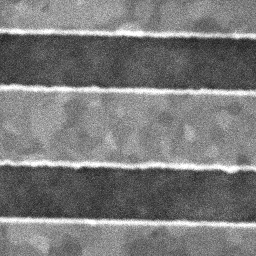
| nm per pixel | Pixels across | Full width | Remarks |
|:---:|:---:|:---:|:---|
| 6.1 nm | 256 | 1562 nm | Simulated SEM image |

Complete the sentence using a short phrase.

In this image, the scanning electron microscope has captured one or a few lines or trenches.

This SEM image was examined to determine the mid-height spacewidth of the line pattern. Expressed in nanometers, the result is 348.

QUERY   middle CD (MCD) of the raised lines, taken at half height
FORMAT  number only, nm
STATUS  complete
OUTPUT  460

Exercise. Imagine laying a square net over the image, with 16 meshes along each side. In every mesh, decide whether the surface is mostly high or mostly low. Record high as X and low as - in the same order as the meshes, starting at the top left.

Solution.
XXXXXXXXXXXXXXXX
XXXXXXXXXXXXXXXX
----------------
----------------
----------------
X---------------
XXXXXXXXXXXXXXXX
XXXXXXXXXXXXXXXX
XXXXXXXXXXXXXXXX
XXXXXXXXXXXXXXXX
--------------XX
----------------
----------------
----------------
XXXXXXXXXXXXXXXX
XXXXXXXXXXXXXXXX